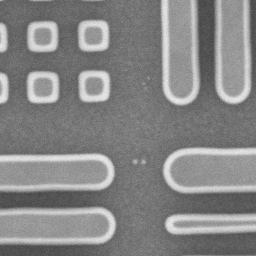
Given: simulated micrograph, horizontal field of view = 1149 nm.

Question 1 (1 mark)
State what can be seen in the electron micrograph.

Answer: groups of lines, slits or small figures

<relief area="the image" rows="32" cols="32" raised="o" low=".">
.....................ooo...oooo.
.....................ooo...oooo.
.....................ooo...oooo.
....ooo...ooo........ooo...oooo.
o...ooo...ooo........ooo...oooo.
o...ooo...ooo........ooo...oooo.
.....................ooo...oooo.
.....................ooo...oooo.
.....................oooo..oooo.
....ooo...ooo........oooo..oooo.
o...ooo...ooo........oooo..oooo.
o...ooo...ooo........ooo...oooo.
......................oo.....o..
................................
................................
................................
................................
................................
................................
......................oooooooooo
oooooooooooooo.......ooooooooooo
oooooooooooooo.......ooooooooooo
oooooooooooooo.......ooooooooooo
ooooo.................oooooooooo
................................
................................
.oooooooooooo...................
oooooooooooooo.......ooooooooooo
oooooooooooooo.......ooooooooooo
oooooooooooooo..................
................................
................................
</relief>